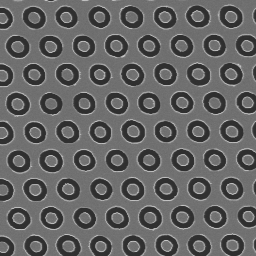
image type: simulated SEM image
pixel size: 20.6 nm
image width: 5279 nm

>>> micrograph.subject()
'a regular array of ring-shaped grooves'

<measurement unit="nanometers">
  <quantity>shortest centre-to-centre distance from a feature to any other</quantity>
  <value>664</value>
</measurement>